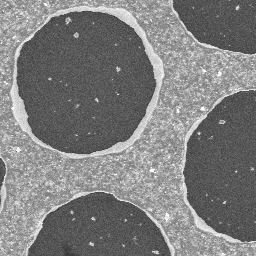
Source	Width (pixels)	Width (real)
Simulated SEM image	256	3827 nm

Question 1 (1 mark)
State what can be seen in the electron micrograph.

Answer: holes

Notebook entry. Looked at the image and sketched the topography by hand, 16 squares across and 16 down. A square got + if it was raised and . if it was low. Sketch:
+++++++++++.....
+++.....+++.....
++.......+++....
+.........++++++
+.........++++++
+.........++++++
+.........++++..
+........++++...
++.......+++....
++++...+++++....
+++++++++++.....
++++++++++++....
+++++...++++....
+++......+++....
++........++++..
++.........+++++